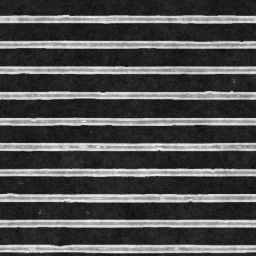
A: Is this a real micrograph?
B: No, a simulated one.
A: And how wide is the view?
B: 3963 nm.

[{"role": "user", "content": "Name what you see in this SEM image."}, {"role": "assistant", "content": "parallel lines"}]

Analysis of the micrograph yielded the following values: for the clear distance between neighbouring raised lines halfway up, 306 nanometers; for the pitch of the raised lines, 0.395 µm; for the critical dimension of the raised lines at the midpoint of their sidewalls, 5.88 pixels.